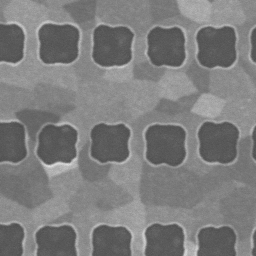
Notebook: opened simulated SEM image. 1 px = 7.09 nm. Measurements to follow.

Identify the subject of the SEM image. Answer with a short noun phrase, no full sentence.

a regular array of holes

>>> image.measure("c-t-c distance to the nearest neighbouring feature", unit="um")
0.376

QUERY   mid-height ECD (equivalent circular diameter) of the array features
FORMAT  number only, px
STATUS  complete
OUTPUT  44.3